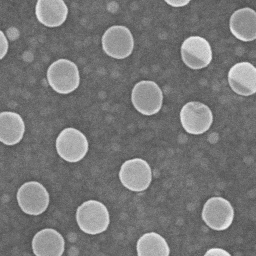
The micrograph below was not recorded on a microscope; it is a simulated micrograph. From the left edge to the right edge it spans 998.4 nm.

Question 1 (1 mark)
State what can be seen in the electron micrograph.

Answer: a regular array of raised bodies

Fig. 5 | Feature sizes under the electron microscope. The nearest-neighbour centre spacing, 245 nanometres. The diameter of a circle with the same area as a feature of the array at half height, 126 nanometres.